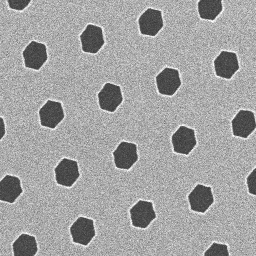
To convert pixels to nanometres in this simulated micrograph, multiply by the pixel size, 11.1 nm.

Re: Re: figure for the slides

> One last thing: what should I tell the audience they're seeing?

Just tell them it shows a regular array of holes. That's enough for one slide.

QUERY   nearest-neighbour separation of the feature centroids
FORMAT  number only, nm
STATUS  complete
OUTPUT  670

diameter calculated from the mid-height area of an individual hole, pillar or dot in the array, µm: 0.289